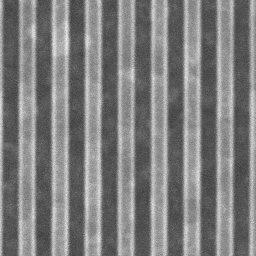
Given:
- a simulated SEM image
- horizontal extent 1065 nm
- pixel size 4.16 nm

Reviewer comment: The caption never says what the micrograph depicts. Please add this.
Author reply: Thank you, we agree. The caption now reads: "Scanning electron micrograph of parallel lines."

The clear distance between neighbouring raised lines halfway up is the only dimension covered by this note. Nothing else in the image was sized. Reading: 83.3 nm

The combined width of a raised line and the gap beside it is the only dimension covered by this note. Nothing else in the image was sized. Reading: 137 nanometers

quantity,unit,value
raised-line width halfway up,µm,0.0541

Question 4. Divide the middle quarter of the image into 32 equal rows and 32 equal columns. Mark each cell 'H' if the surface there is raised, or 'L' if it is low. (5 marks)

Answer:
HLLLLLHHHLLLLLHHHLLLLLHHHLLLLLHH
HLLLLLHHHLLLLLHHHLLLLLHHHLLLLLHH
HLLLLLHHHLLLLLHHHLLLLLHHHLLLLLHH
HLLLLLHHHLLLLLHHHLLLLLHHHLLLLLHH
HLLLLLHHHLLLLLHHHLLLLLHHHLLLLLHH
HLLLLLHHHLLLLLHHHLLLLLHHHLLLLLHH
HLLLLLHHHLLLLLHHHLLLLLHHHLLLLLHH
LLLLLLHHHLLLLLHHHLLLLLHHHLLLLLHH
LLLLLLHHHLLLLLHHHLLLLLHHHLLLLLLH
LLLLLLHHHLLLLLHHHLLLLLHHHLLLLLLH
LLLLLLHHHLLLLLHHHLLLLLHHHLLLLLLH
LLLLLLHHHLLLLLHHHLLLLLHHHLLLLLLH
LLLLLLHHHLLLLLHHHLLLLLHHHLLLLLLH
LLLLLLHHHLLLLLHHHLLLLLHHHLLLLLLH
LLLLLLHHHLLLLLHHHLLLLLHHHLLLLLHH
LLLLLLHHHLLLLLHHHLLLLLHHHLLLLLHH
LLLLLLHHHLLLLLHHHLLLLLHHHLLLLLHH
LLLLLLHHHLLLLLHHHLLLLLHHHLLLLLHH
LLLLLLHHHLLLLLHHHLLLLLHHHLLLLLHH
LLLLLLHHHLLLLLHHHLLLLLHHHLLLLLHH
LLLLLLHHHLLLLLHHHLLLLLHHHLLLLLHH
LLLLLLHHHLLLLLHHHLLLLLHHHLLLLLHH
LLLLLLHHHLLLLLHHHLLLLLHHHLLLLLHH
LLLLLLHHHLLLLLHHHLLLLLHHHLLLLLHH
LLLLLLHHHLLLLLHHHLLLLLHHHLLLLLHH
LLLLLLHHHLLLLLHHHLLLLLHHHLLLLLHH
LLLLLLHHHLLLLLHHHLLLLLHHHLLLLLHH
LLLLLLHHHLLLLLHHHLLLLLHHHLLLLLLH
HLLLLLHHHLLLLLHHHLLLLLHHHLLLLLLH
HLLLLLHHHLLLLLHHHLLLLLHHHLLLLLHH
HLLLLLHHHLLLLLHHHLLLLLHHHLLLLLHH
HLLLLLHHHLLLLLHHHLLLLLHHHLLLLLHH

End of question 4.